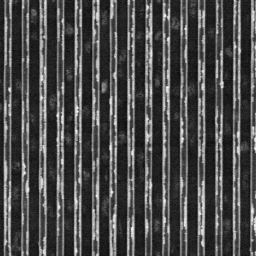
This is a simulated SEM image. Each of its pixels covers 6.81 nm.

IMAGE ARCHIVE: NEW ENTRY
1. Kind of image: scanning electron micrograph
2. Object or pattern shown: parallel lines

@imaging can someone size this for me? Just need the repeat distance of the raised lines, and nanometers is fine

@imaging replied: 120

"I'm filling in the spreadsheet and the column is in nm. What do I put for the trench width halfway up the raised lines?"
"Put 74.9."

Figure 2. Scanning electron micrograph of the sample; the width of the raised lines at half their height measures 43.4 nm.